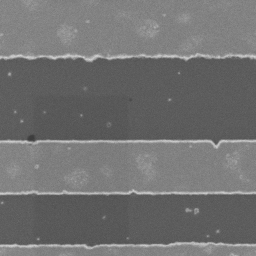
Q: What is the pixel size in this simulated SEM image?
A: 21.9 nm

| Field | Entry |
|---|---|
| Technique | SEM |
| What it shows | one or a few lines or trenches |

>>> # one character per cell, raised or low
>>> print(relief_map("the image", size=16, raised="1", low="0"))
1111111111111111
1111111111111111
1111111111111111
1111111111110100
0000000000000000
0000000000000000
0000000000000000
0000000000000000
0000000000000000
1111111111111111
1111111111111111
1111111111111111
0000000000000000
0000000000000000
0000000000000000
1111111111111111